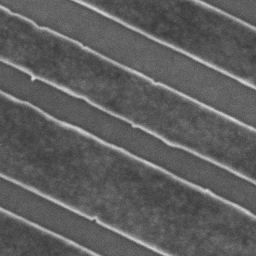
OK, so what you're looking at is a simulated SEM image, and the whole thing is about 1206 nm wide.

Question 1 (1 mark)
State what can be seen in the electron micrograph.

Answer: one or a few lines or trenches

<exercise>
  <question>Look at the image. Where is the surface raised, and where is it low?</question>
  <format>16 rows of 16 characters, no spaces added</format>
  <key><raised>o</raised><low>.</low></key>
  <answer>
......ooooooo...
oo......ooooooo.
ooooo.....oooooo
oooooo......oooo
..oooooo......oo
....ooooooo.....
oo....ooooooo...
oooo....ooooooo.
oooooo....oooooo
oooooooo....oooo
oooooooooo....oo
.ooooooooooo....
...ooooooooooo..
o....ooooooooooo
ooo....ooooooooo
ooooo....ooooooo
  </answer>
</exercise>